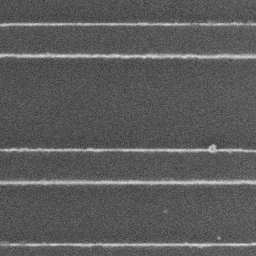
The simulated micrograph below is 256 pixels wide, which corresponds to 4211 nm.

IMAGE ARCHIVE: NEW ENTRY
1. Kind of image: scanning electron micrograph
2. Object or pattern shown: lines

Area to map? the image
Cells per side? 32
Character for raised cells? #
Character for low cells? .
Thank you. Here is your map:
................................
................................
................................
################################
################################
################################
################################
................................
................................
................................
................................
................................
................................
................................
................................
................................
................................
................................
..........................#.....
################################
################################
################################
################################
................................
................................
................................
................................
................................
................................
................................
.....#..........................
################################